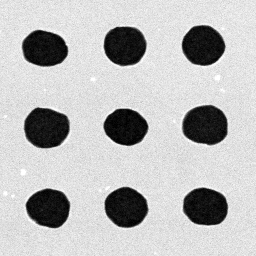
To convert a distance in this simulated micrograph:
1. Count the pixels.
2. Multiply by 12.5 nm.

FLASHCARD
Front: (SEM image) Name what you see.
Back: a regular array of holes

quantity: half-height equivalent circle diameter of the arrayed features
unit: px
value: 41.4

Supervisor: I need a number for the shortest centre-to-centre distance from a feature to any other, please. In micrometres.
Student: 0.991